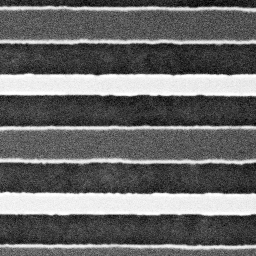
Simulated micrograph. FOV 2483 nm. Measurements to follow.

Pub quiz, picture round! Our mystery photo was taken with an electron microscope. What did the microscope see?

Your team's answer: lines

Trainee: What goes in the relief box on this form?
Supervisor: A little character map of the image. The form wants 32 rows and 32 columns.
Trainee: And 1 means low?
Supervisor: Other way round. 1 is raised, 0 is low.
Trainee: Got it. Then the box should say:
00000000000000000000000000000000
11111111111111111111111111111111
11111111111111111111111111111111
11111111111111111111111111111111
11111111111111111111111111111111
00000000000000000000000000000000
00000000000000000000000000000000
00000000000000000000000000000000
00000000000000000000000000000000
11111111111101111111110111110111
11111111111111111111111111111111
11111111111111111111111111111111
00000000000000000000000000000000
00000000000000000000000000000000
00000000000000000000000000000000
00000000000000000000000000000000
11111111111111111111111111111111
11111111111111111111111111111111
11111111111111111111111111111111
11111111111111111111111111111111
00000000000000000000000000000000
00000000000000000000000000000000
00000000000000000000000000000000
00000000000000000000000000000000
11111111111111111111111111111111
11111111111111111111111111111111
11111111111111111111111111111111
00000000000000000000000000000000
00000000000000000000000000000000
00000000000000000000000000000000
00000000000000000000000000000000
11111111111111111111111111111111